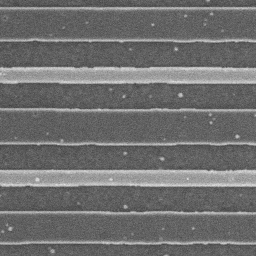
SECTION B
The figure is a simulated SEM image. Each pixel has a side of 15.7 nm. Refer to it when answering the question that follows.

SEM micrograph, lines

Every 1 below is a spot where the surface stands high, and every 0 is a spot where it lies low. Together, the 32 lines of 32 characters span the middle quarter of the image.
00000000000000000000000000000000
11111111111111111111111111111111
11111111111111111111111111111111
11111111111111111111111111111111
11111111111111111111111111111111
00000000000000000000000000000000
00000000000000000000000000000000
00000000000000000000000000000000
00000000000000000000000000000000
00000000000000000000000000000000
00000000000000000000000000000000
11110000100000000000011101000111
11111111111111111111111111111111
11111111111111111111111111111111
11111111111111111111111111111111
11111111111111111111111111111111
11111111111111111111111111111111
11111111111111111111111111111111
11111111111111111111111111111111
11111111111111111111111111111111
00000000000000000000000000000000
00000000000000000000000000000000
00000000000000000000000000000000
00000000000000000000000000000000
00000000000000000000000000000000
00000000000000000000000000000000
00000000000000000000000000000000
11111111111111111111111111111111
11111111111111111111111111111111
11111111111111111111111111111111
00000000000000000000000000000000
00000000000000000000000000000000